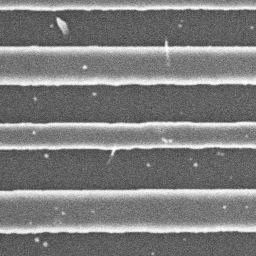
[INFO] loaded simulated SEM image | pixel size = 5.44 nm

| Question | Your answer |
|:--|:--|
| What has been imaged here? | lines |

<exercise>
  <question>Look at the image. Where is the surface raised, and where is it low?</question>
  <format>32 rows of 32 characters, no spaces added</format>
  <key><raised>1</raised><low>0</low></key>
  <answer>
11111111111111111111111111111111
00000000000000000000000000000000
00000000000000000000000000000000
00000000000000000000000000000000
00000000000000000000000000000000
00000000000000000000000000000000
11111111111111111111111111111111
11111111111111111111111111111111
11111111111111111111111111111111
11111111111111111111111111111111
00111101000000100000000000000000
00000000000000000000000000000000
00000000000000000000000000000000
00000000000000000000000000000000
00000000000000000000000000000000
00100011111100000111111111111111
11111111111111111111111111111111
11111111111111111111111111111111
11111111111111111010000010000000
00000000000000000000000000000000
00000000000000000000000000000000
00000000000000000000000000000000
00000000000000000000000000000000
00000000000000000000000000000000
11111111111111111111111111111111
11111111111111111111111111111111
11111111111111111111111111111111
11111111111111111111111111111111
11111111111111111111111111111111
00000000000000000000000000000000
00000000000000000000000000000000
00000000000000000000000000000000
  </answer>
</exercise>